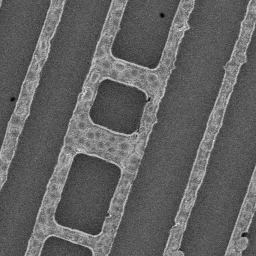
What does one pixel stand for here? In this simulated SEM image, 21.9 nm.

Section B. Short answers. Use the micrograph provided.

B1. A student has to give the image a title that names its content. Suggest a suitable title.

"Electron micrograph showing one or a few lines or trenches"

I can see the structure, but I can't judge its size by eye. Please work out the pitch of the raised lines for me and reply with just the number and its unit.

1370 nm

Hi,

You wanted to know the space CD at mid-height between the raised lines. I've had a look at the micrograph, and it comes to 48.9 pixels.